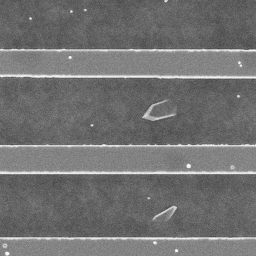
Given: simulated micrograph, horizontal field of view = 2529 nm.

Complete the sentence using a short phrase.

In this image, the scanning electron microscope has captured lines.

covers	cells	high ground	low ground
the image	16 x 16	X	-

----------------
----------------
----------------
XXXXXXXXXXXXXXXX
XXXXXXXXXXXXXXXX
----------------
----------------
----------------
----------------
XXXXXXXXXXXXXXXX
XXXXXXXXXXXXXXXX
----------------
----------------
----------------
----------------
XXXXXXXXXXXXXXXX